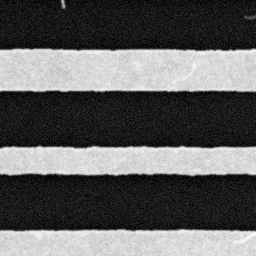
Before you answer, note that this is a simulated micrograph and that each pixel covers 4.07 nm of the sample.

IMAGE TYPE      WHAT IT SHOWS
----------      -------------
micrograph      lines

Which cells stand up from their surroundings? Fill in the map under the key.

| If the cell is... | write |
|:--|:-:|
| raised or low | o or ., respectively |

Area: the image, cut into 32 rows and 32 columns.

................................
................................
................................
................................
................................
................................
oooooooooooooooooooooooooooooooo
oooooooooooooooooooooooooooooooo
oooooooooooooooooooooooooooooooo
oooooooooooooooooooooooooooooooo
oooooooooooooooooooooooooooooooo
................................
................................
................................
................................
................................
................................
................................
...........o.....o..............
oooooooooooooooooooooooooooooooo
oooooooooooooooooooooooooooooooo
oooooooooooooooooooooooooooooooo
................................
................................
................................
................................
................................
................................
................................
oooooooooooooooooooooooooooooooo
oooooooooooooooooooooooooooooooo
oooooooooooooooooooooooooooooooo